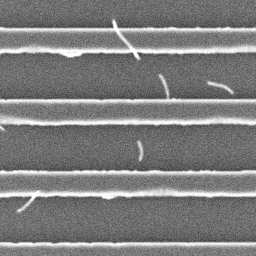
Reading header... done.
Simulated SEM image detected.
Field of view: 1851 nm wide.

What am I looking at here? lines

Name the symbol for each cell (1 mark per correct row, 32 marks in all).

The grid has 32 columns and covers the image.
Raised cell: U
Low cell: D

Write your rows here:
DDDDDDDDDDDDDDDDDDDDDDDDDDDDDDDD
DDDDDDDDDDDDDDDDDDDDDDDDDDDDDDDD
DDDDDDDDDDDDDDDDDDDDDDDDDDDDDDDD
DDDDDDDDDDDDDDUDDDDDDDDDDDDDDDDD
UUUUUUUUUUUUUUUUUUUUUUUUUUUUUUUU
UUUUUUUUUUUUUUUUUUUUUUUUUUUUUUUU
UDDDDDDDUUUDDDDUUUUUDUUUDDDDDDDD
DDDDDDDDDDDDDDDDDDDDDDDDDDDDDDDD
DDDDDDDDDDDDDDDDDDDDDDDDDDDDDDDD
DDDDDDDDDDDDDDDDDDDDDDDDDDDDDDDD
DDDDDDDDDDDDDDDDDDDDDDDDDDDDDDDD
DDDDDDDDDDDDDDDDDDDDDDDDDDDDDDDD
DDDDDDDDDDDDDDDDDDDDDUDDDDDDDDDD
UUUUUUUUUUUUUUUUUUUUUUUUUUUUUUUU
UUUUUUUUUUUUUUUUUUUUUUUUUUUUUUUU
DDDDDUUUDDDDDDDDDDDDDDDDDDDDDDDD
DDDDDDDDDDDDDDDDDDDDDDDDDDDDDDDD
DDDDDDDDDDDDDDDDDDDDDDDDDDDDDDDD
DDDDDDDDDDDDDDDDDDDDDDDDDDDDDDDD
DDDDDDDDDDDDDDDDDDDDDDDDDDDDDDDD
DDDDDDDDDDDDDDDDDDDDDDDDDDDDDDDD
UUUUUUDDDUUUUUUUUUUUDDUUDUUDDDUU
UUUUUUUUUUUUUUUUUUUUUUUUUUUUUUUU
UUUUUUUUUUUUUUUUUUUUUUUUUUUUUUUU
DDDDUDDDDDDDDDDDDDDDDDDDDDDDDDDD
DDDDDDDDDDDDDDDDDDDDDDDDDDDDDDDD
DDDDDDDDDDDDDDDDDDDDDDDDDDDDDDDD
DDDDDDDDDDDDDDDDDDDDDDDDDDDDDDDD
DDDDDDDDDDDDDDDDDDDDDDDDDDDDDDDD
DDDDDDDDDDDDDDDDDDDDDDDDDDDDDDDD
UUUUUUUUUUUUUUUUUUUUUUUUUUUUUUUU
UUUUUUUUUUUUUUUUUUUUUUUUUUUUUUUU